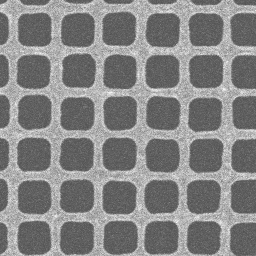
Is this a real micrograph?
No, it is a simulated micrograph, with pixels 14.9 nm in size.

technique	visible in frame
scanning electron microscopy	a regular array of holes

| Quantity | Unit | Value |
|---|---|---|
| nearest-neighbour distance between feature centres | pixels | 41.1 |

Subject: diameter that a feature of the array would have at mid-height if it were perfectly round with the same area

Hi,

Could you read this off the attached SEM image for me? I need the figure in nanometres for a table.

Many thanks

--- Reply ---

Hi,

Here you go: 548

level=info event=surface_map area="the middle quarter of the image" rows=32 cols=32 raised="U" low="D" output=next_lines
DDDDDDDDUUDDDDDDDDUUDDDDDDDDDUUD
DDDDDDDDUUDDDDDDDDUUDDDDDDDDDUUD
DDDDDDDDUUDDDDDDDDUUDDDDDDDDDUUD
DDDDDDDDUUDDDDDDDDUUDDDDDDDDDUUD
DDDDDDDDUUDDDDDDDDUUUDDDDDDDDUUD
DDDDDDDUUUDDDDDDDUUUUDDDDDDDUUUU
UUUUUUUUUUUUUUUUUUUUUUUUUUUUUUUU
UUUUUUUUUUUUUUUUUUUUUUUUUUUUUUUU
DDDDDDUUUUUDDDDDDUUUUDDDDDDDUUUU
DDDDDDDUUUDDDDDDDDUUUDDDDDDDDUUU
DDDDDDDDUUDDDDDDDDUUUDDDDDDDDUUD
DDDDDDDDUUDDDDDDDDUUDDDDDDDDDUUD
DDDDDDDDUUDDDDDDDDUUDDDDDDDDDUUD
DDDDDDDDUUDDDDDDDDUUDDDDDDDDDUUD
DDDDDDDDUUDDDDDDDDUUDDDDDDDDDUUD
DDDDDDDUUUDDDDDDDUUUUDDDDDDDDUUD
DDDDDDUUUUUDDDDUUUUUUUUUDDDUUUUU
UUUUUUUUUUUUUUUUUUUUUUUUUUUUUUUU
DDDDDDUUUUUUDDDDUUUUUUUUUUUUUUUU
DDDDDDDUUUDDDDDDDDUUUDDDDDDDUUUU
DDDDDDDUUUDDDDDDDDUUDDDDDDDDDUUD
DDDDDDDUUDDDDDDDDDUUDDDDDDDDDUUD
DDDDDDDUUUDDDDDDDDUUDDDDDDDDDUUD
DDDDDDDUUUDDDDDDDDUUDDDDDDDDDUUD
DDDDDDDUUUDDDDDDDDUUDDDDDDDDDUUD
DDDDDDDUUUDDDDDDDDUUDDDDDDDDDUUD
DDDDDDDUUUUDDDDDDUUUUDDDDDDDUUUU
UUUUUUUUUUUUUUUUUUUUUUUUUUUUUUUU
UUUUUUUUUUUUUUUUUUUUUUUUUUUUUUUU
DDDDDDDUUUUDDDDDDUUUUDDDDDDDUUUD
DDDDDDDUUUDDDDDDDDUUDDDDDDDDUUUD
DDDDDDDDUUDDDDDDDDUUDDDDDDDDDUUD